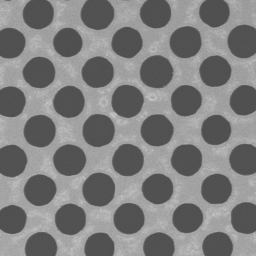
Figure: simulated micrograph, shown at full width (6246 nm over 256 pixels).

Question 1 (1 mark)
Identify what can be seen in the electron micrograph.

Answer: a regular array of holes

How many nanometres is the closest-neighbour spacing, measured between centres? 1010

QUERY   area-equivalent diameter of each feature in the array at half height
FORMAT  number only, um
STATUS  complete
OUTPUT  0.777